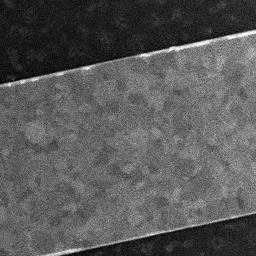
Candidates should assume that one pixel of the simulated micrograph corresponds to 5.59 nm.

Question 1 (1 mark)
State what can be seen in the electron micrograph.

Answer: one or a few lines or trenches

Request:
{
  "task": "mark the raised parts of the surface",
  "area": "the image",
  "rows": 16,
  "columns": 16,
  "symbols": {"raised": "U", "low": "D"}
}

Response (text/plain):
DDDDDDDDDDDDDDDD
DDDDDDDDDDDDDDDD
DDDDDDDDDDDDDUUU
DDDDDDDDUUUUUUUU
DDDDUUUUUUUUUUUU
UUUUUUUUUUUUUUUU
UUUUUUUUUUUUUUUU
UUUUUUUUUUUUUUUU
UUUUUUUUUUUUUUUU
UUUUUUUUUUUUUUUU
UUUUUUUUUUUUUUUU
UUUUUUUUUUUUUUUU
UUUUUUUUUUUUUUUU
UUUUUUUUUUUUUUUD
UUUUUUUUUUDDDDDD
UUUUUUDDDDDDDDDD